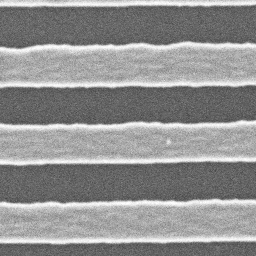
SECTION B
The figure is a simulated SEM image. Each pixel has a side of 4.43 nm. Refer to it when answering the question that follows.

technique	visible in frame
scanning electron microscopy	lines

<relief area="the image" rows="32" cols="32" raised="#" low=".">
################################
................................
................................
................................
................................
.................#....####..#...
################################
################################
################################
################################
################################
................................
................................
................................
................................
...............########.########
################################
################################
################################
################################
..##............................
................................
................................
................................
................................
##..############################
################################
################################
################################
################################
................................
................................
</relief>